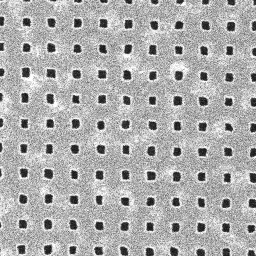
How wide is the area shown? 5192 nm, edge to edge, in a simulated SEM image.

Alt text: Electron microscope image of a regular array of holes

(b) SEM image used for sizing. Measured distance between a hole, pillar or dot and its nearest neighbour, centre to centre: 0.499 µm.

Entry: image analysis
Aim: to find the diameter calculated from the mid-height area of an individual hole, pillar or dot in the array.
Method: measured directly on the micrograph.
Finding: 189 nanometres